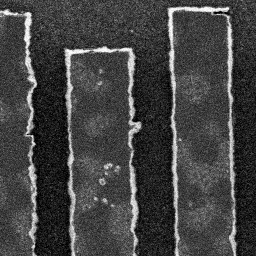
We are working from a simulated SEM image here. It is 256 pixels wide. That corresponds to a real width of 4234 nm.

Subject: one or a few lines or trenches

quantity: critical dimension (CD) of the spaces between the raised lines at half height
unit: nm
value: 643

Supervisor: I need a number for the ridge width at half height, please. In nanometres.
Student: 984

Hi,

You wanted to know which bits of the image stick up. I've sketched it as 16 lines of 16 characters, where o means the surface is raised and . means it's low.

...........o....
oo.........ooo..
oo.........ooo..
oo..oooo...ooo..
oo..oooo...ooo..
oo..oooo...ooo..
oo..oooo...ooo..
oo..oooo...ooo..
oo..oooo...ooo..
oo..oooo...ooo..
oo..oooo...ooo..
oo..oooo...oooo.
oo...ooo...oooo.
oo..oooo...oooo.
oo...ooo...oooo.
oo...ooo...oooo.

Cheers